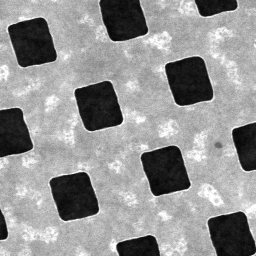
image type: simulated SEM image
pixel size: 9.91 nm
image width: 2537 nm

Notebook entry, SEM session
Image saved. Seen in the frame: holes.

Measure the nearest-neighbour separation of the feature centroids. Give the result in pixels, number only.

92.6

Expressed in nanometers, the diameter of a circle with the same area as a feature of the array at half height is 474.